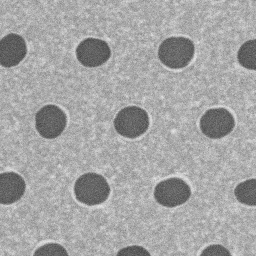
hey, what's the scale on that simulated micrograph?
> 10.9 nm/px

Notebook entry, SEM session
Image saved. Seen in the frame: holes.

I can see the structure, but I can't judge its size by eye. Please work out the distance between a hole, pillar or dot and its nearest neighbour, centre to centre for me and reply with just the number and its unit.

0.879 microns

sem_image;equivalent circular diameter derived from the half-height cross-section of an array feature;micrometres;0.38